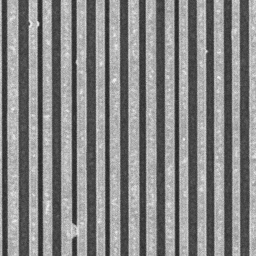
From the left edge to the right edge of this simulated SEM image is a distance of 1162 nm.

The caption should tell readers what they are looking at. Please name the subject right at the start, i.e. parallel lines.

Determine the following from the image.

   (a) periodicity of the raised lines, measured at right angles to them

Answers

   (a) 77.7 nanometers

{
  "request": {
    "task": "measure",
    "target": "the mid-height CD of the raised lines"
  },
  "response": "8.74 pixels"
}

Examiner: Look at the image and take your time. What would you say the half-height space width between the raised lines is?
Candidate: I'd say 0.0397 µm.